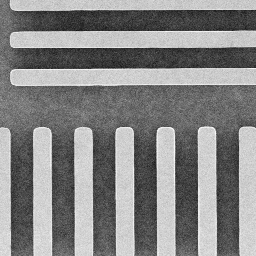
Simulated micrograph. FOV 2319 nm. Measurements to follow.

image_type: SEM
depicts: groups of lines, slits or small figures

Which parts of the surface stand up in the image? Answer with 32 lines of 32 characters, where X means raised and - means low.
-XXXXXXXXXXXXXXXXXXXXXXXXXXXXXXX
--------------------------------
--------------------------------
--------------------------------
-XXXXXXXXXXXXXXXXXXXXXXXXXXXXXXX
-XXXXXXXXXXXXXXXXXXXXXXXXXXXXXXX
--------------------------------
--------------------------------
--------------------------------
-XXXXXXXXXXXXXXXXXXXXXXXXXXXXXXX
--XXXXXXXXXXXXXXXXXXXXXXXXXXXXXX
--------------------------------
--------------------------------
--------------------------------
--------------------------------
--------------------------------
X---XX---XX----XX---XX---XX---XX
X---XX---XX----XX---XX---XX---XX
X---XX---XX----XX---XX---XX---XX
X---XX---XX----XX---XX---XX---XX
X---XX---XX----XX---XX---XX---XX
X---XX---XX----XX---XX---XX---XX
X---XX---XX----XX---XX---XX---XX
X---XX---XX----XX---XX---XX---XX
X---XX---XX----XX---XX---XX---XX
X---XX---XX----XX---XX---XX---XX
X---XX---XXX---XX---XX---XX---XX
X---XX---XXX---XX---XX---XX---XX
X---XX---XXX---XX---XX---XX---XX
X---XX---XXX---XX---XX---XX---XX
X---XX---XXX---XX---XX---XX---XX
X---XX---XXX---XX---XX---XX---XX